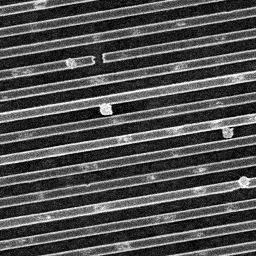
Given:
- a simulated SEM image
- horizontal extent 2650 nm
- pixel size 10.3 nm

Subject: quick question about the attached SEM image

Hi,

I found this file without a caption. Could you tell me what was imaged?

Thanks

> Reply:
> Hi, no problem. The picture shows parallel lines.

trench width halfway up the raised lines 124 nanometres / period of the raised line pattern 218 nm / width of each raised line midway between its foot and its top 88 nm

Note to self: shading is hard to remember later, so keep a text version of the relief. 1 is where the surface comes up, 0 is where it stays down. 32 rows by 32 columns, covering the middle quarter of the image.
11110000000000000000000011111111
00000000000000000011111111111100
00000000000011111111111100000000
00000011111111111100000000000000
11111111111100000000000000000000
11111100000000000000000000111111
00000000000000000000111111111111
00000000000000111111111111100000
00000000111111111111100000000000
00111111111111100000000000000000
11111111111100000000000000011111
11100000011100000000011111111111
00000000001100011111111111111000
00000000011111111111110000000000
00011111111111110000000000000000
11111111111000000000000000000011
11111000000000000000000011111111
00000000000000000011111111111100
00000000000011111111111100000000
00000011111111111100000000000000
11111111111100000000000000000000
11111100000000000000000000111111
00000000000000000000111111111111
00000000000000111111111111000000
00000000111111111111000000000000
00111111111111000000000000000000
11111111000000000000000000011111
11000000000000000000001111111111
00000000000000011111111111111000
00000000011111111111111000000000
00011111111111111000000000000000
11111111111000000000000000000111